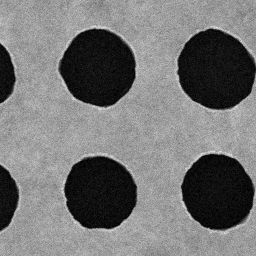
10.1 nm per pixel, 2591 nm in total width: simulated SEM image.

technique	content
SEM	holes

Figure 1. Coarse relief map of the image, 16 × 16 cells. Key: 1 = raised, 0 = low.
1111111111111111
1111111111111111
1111100011110001
0111000011100000
0111000011100000
0111000011100000
1111110111110001
1111111111111111
1111111111111111
1111111111111111
1111100011110001
0111000011100000
0111000001100000
0111100011110001
1111111111111111
1111111111111111